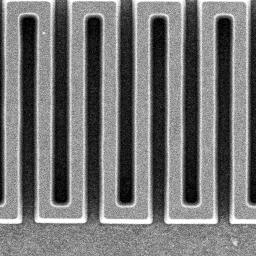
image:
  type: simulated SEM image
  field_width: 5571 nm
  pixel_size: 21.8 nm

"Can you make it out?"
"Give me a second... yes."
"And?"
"groups of lines, slits or small figures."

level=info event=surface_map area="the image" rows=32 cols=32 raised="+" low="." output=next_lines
.++++++..++++++..++++++..++++++.
.++++++..++++++..++++++..++++++.
.++..++..++..++..++..++..++..++.
.+...++..++..++..++..++..++..++.
+++..++..++..++..++..++..++..++.
+++..++..++..++..++..++..++..++.
+++..++..++..++..++..++..++..++.
+++..++..++..++..++..++..++..++.
.+...++..++..++..++..++..++..++.
.+...++..++..++..++..++..++..++.
.+...++..++..++..++..++..++..++.
++...++..++..++..++..++..++..++.
+++..++..++..++..++..++..++..++.
+++..++..++..++..++..++..++..++.
+++..++..++..++..++..++..++..++.
+++..++..++..++..++..++..++..++.
++...++..++..++..++..++..++..++.
++...++..++..++..++..++..++..++.
++...++..++..++..++..++..++..++.
++...++..++..++..++..++..++..++.
++...++..++..++..++..++..++..++.
++...++..++..++..++..++..++..++.
.+...++..++..++..++..++..++..++.
.+...++..++..++..++..++..++..++.
++...+...++..++..++..++..++..++.
++...++.+++..++.+++..++.+++..++.
++...++++++..++++++..++++++..+++
++...+++++...++++++..++++++..+++
................................
................................
................................
................................